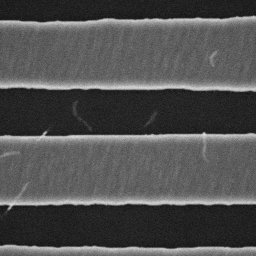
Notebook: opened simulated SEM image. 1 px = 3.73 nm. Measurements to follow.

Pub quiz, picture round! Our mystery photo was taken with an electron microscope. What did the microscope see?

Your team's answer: lines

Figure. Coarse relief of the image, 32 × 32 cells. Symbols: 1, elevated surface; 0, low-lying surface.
00000000000000000000000000000000
00000000000000000000000000000000
00000000000011111111111111111111
11111111111111111111111111111111
11111111111111111111111111111111
11111111111111111111111111111111
11111111111111111111111111111111
11111111111111111111111111111111
11111111111111111111111111111111
11111111111111111111111111111111
11111111111111111111111111111111
00000000000000000000000000000000
00000000000000000000000000000000
00000000000000000000000000000000
00000000000000000000000000000000
00000000000000000000000000000000
00000000000000000000000000000000
11111111111111111111111111111111
11111111111111111111111111111111
11111111111111111111111111111111
11111111111111111111111111111111
11111111111111111111111111111111
11111111111111111111111111111111
11111111111111111111111111111111
11111111111111111111111111111111
11111111000000100011001001101000
00000000000000000000000000000000
00000000000000000000000000000000
00000000000000000000000000000000
00000000000000000000000000000000
00000000000000000000000000000000
11111111111111111111111111111111